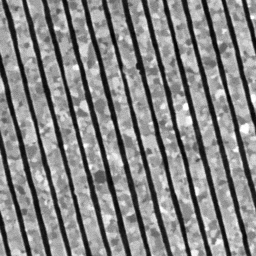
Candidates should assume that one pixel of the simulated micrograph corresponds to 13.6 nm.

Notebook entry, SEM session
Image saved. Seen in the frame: parallel lines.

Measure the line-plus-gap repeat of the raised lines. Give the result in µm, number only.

0.264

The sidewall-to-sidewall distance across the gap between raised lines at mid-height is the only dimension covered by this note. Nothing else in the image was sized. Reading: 77.6 nm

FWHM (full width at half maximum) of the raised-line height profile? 180 nm